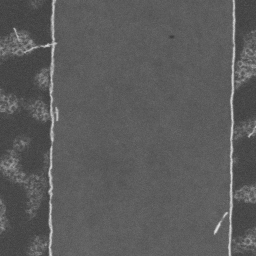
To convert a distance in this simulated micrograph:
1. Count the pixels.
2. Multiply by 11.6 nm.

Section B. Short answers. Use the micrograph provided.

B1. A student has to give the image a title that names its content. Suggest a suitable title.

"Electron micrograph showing one or a few lines or trenches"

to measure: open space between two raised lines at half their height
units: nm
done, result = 2100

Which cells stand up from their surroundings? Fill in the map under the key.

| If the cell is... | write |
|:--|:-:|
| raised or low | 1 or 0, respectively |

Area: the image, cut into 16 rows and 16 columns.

1110000000000001
1110000000000001
1110000000000001
1110000000000001
1110000000000001
1110000000000001
1110000000000011
1110000000000001
1110000000000011
1110000000000011
1110000000000011
1110000000000011
1110000000000011
1110000000000011
1110000000000011
1110000000000011